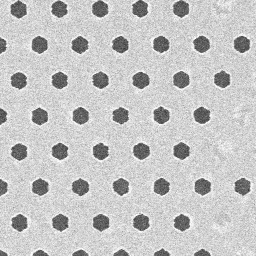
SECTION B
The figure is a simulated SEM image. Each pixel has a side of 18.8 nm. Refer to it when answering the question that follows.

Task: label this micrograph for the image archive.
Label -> a regular array of holes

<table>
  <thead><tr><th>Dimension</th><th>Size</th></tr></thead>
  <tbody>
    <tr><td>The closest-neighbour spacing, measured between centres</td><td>0.761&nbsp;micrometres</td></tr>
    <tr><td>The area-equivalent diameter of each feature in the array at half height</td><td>0.327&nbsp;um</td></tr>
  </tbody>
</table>